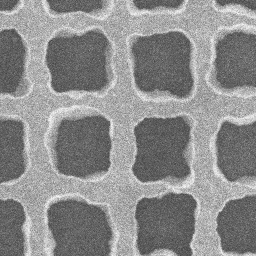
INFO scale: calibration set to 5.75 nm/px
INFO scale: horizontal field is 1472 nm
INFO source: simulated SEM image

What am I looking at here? holes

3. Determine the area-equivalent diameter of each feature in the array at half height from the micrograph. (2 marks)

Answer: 0.387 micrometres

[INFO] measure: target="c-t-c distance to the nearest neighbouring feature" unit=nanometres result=471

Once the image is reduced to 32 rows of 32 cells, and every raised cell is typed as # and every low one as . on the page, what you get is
..####........###......####.....
######.......###################
################################
################################
...####......####......####.....
...###........##........###.....
...###........##........###.....
...###........###.......###.....
...###........###.......##......
...###........###.......##......
....##........###.......###.....
...####.###..#####......####.###
################################
################################
#########....#########.#########
...####.......###.......####.##.
...####.......###.......###.....
...###........###.......###.....
...###........###.......###.....
...####.......###.......###.....
...####.......###.......###.....
...####......####.......####....
..########.######......#####....
################################
####################....######..
...###......#####........###....
...###........###.......####....
...###........###.......###.....
...###........###.......###.....
...###........###.......###.....
...####.......###.......####....
...####.......###..###..####....